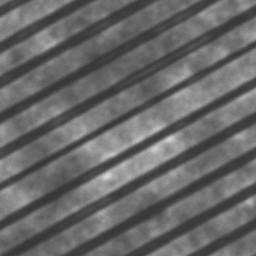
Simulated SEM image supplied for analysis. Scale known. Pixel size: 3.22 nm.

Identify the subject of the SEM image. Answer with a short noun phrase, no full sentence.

parallel lines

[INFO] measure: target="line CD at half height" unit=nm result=64.3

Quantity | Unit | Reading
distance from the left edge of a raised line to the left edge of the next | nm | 99.8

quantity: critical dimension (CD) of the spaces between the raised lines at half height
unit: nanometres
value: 35.2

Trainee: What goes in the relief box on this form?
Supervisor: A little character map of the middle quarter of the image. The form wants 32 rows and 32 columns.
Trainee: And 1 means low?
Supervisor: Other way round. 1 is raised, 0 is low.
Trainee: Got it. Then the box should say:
11110000001111111111100000111111
11100000111111111110010001111111
10000011111111111000000111111111
00000111111111100000011111111110
00011111111110000001111111111000
01111111111100000111111111100001
11111111110000011111111111000111
11111111000000111111111100001111
11111100000011111111110000111111
11110000001111111111000011111111
11100000111111111110001111111111
10000011111111110000011111111111
00000111111111100001111111111110
00011111111110000111111111111000
01111111111000011111111111100000
11111111100001111111111111000001
11111111000011111111111100000011
11111100001111111111110000001111
11110000111111111111000000111111
11000011111111111110000011111111
10001111111111111000001111111111
00011111111111100000011111111100
01111111111110000001111111111000
11111111111000000111111111100000
11111111100000011111111110000001
11111111000001111111111000000111
11111100000111111111100000001111
11111000011111111110000000111111
11100000111111111100000011111111
10000011111111110000001111111111
00001111111111000000111111111100
00011111111110000011111111110000